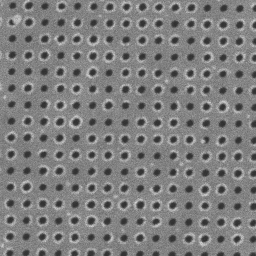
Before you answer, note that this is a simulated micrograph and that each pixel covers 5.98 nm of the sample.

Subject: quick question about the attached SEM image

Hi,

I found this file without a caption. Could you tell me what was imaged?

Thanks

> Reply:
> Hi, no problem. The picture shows a regular array of holes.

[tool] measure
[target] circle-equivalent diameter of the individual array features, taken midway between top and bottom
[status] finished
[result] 44.3 nm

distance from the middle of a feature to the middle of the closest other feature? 96.1 nm